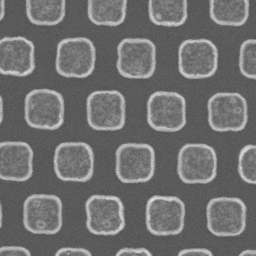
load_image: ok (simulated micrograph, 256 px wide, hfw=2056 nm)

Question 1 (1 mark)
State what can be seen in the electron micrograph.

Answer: a regular array of raised bodies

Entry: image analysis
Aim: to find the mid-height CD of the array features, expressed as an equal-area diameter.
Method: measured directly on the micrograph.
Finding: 313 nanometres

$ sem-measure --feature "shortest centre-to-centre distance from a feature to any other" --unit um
0.483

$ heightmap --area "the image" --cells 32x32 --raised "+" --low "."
....++++...+++++...++++...+++++.
....++++...++++....++++...+++++.
....+++.....+++....++++....++++.
................................
................................
++++....+++....++++....+++.....+
++++...+++++...++++....++++...++
++++...+++++...++++....++++...++
++++...+++++...++++....++++...++
................++......++.....+
................................
....++..........................
...+++++...++++....++++...++++..
...+++++...++++....++++...+++++.
...+++++...++++....++++...+++++.
....+++....++++....++++...++++..
................................
................................
++++...++++....++++....+++.....+
++++...++++....++++....++++...++
++++...++++....++++...+++++...++
++++...++++....++++...+++++...++
...............+++.....+++.....+
................................
................................
...+++++...++++....++++...++++..
...++++....++++....++++...++++..
...++++....++++....++++...++++..
....+++....++++....++++...++++..
................................
................................
+++....++++....+++.....+++.....+